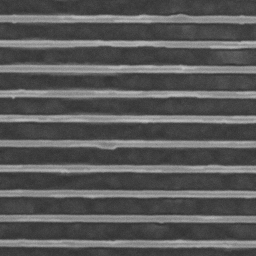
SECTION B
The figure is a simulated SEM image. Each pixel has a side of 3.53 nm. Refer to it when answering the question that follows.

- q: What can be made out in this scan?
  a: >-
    parallel lines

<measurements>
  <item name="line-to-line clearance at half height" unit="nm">65.3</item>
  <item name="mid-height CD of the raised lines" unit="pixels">6.26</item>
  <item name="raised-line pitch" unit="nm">88.1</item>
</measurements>